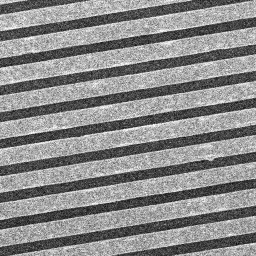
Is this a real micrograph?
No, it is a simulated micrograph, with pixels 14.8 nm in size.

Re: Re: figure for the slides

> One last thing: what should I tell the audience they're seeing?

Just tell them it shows parallel lines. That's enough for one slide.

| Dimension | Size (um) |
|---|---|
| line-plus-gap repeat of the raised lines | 0.394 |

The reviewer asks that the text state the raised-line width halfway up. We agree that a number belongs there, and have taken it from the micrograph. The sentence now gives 249 nanometers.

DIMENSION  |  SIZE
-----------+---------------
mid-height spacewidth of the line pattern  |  152 nanometres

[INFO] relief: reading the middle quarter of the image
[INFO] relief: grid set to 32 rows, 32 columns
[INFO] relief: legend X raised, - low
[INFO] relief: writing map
XXXXXXXXXXXXXX-----------------X
XXXXXXX-----------------XXXXXXXX
X-----------------XXXXXXXXXXXXXX
------------XXXXXXXXXXXXXXXXXXXX
------XXXXXXXXXXXXXXXXXXXXXXXX--
XXXXXXXXXXXXXXXXXXXXXXXX--------
XXXXXXXXXXXXXXXXXX--------------
XXXXXXXXXXX-----------------XXXX
XXXXX-----------------XXXXXXXXXX
----------------XXXXXXXXXXXXXXXX
----------XXXXXXXXXXXXXXXXXXXXXX
----XXXXXXXXXXXXXXXXXXXXXXXXX---
XXXXXXXXXXXXXXXXXXXXXXX---------
XXXXXXXXXXXXXXXXX---------------
XXXXXXXXXXX---------------XXXXXX
XXX-----------------XXXXXXXXXXXX
--------------XXXXXXXXXXXXXXXXXX
--------XXXXXXXXXXXXXXXXXXXXXXXX
-XXXXXXXXXXXXXXXXXXXXXXXXXX-----
XXXXXXXXXXXXXXXXXXXXX-----------
XXXXXXXXXXXXXXX-----------------
XXXXXXXX-----------------XXXXXXX
XX-----------------XXXXXXXXXXXXX
-------------XXXXXXXXXXXXXXXXXXX
-------XXXXXXXXXXXXXXXXXXXXXXXX-
-XXXXXXXXXXXXXXXXXXXXXXXX-------
XXXXXXXXXXXXXXXXXXX-------------
XXXXXXXXXXXXX-----------------XX
XXXXXX-----------------XXXXXXXXX
-----------------XXXXXXXXXXXXXXX
-----------XXXXXXXXXXXXXXXXXXXXX
-----XXXXXXXXXXXXXXXXXXXXXXXXX--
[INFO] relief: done